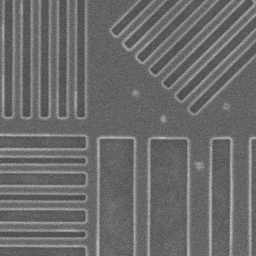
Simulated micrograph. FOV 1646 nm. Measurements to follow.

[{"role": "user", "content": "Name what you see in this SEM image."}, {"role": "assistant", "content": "groups of lines, slits or small figures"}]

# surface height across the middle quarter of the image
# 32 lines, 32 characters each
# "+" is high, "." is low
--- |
.++..+++++++++++++++++...++++...
.++..+++++++++++++++++..++++...+
.++..+++++++++++++++++.++++...++
.++..+++++++++++++++++++++...+++
.++..++++++++++++++++++++...+++.
.++..++++++++++++++++++++..+++..
.++..++++++++++++++++++++++++...
.++..+++++++++++++++++++++++...+
.++..+++++++++++++++++++++++..++
.++..+++++++++++++++++++++++++++
.++..+++++++++++++++++++++++++++
.++..++++++++++++++++++++++++++.
.++..+++++++++++++++++++++++++++
++++++++++++++++++++++++++++++++
++++++++++++++++++++++++++++++++
++++++++++++++++++++++++++++++++
++++++++++++++++++++++++++++++++
++++++++++++++++++++++++++++++++
.....+++++...+++++++++++++++++++
......+++.........+++..........+
......+++.........+++..........+
+++++++++.........+++..........+
+++++++++.........+++..........+
.....++++.........+++..........+
.....++++.........+++..........+
+++++++++.........+++..........+
+++++++++.........+++..........+
.....++++.........+++..........+
......+++........++++..........+
......+++........++++..........+
+++++++++........++++..........+
+++++++++........++++..........+